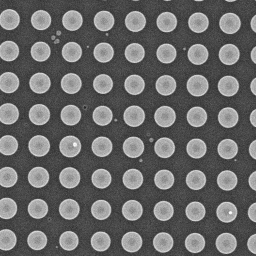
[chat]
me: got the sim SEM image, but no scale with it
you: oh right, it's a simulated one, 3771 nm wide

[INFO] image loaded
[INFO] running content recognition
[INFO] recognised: an array of small figures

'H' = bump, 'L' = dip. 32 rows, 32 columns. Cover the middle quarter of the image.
LLLLLLLLLLLLLLLLLLLLLLLLLLLLLLLL
LLLLLLLLLLLLLLLLLLLLLLLLLLLLLLLL
LHHLLLLLLLLLLLLLLLLLLLLLLLLLLLLL
HHHHLLLLHHHHLLLLHHHLLLLLHHHLLLLL
HHHHLLLHHHHHLLLHHHHHLLLHHHHHLLLH
HHHHLLLHHHHHLLLHHHHHLLLHHHHHLLLH
HHHHLLLLHHHHLLLLHHHHLLLHHHHHLLLH
LLLLLLLLLLLLLLLLLHLLLLLLHHHLLLLL
LLLLLLLLLLLLLLLLLLLLLLLLLLLLLLLL
LLLLLLLLLLLLLLLLLLLLLLLLLLLLLLLL
LHHLLLLLLLLLLLLLLLLLLLLLLLLLLLLL
HHHHLLLLHHHHLLLHHHHHLLLHHHHLLLLH
HHHHLLLHHHHHLLLHHHHHLLLHHHHHLLLH
HHHHLLLHHHHHLLLHHHHHLLLHHHHHLLLH
HHHHLLLLHHHHLLLHHHHHLLLHHHHLLLLH
LLLLLLLLLLLLLLLLLHLLLLLLHHLLLLLL
LLLLLLLLLLLLLLLLLLLLLLLLLLLLLLLL
LLLLLLLLLLLLLLLLLLLLLLLLLLLLLLLL
HHHLLLLLHHHLLLLLHHHLLLLLHHLLLLLL
HHHHLLLHHHHHLLLHHHHHLLLHHHHLLLLH
HHHHLLLHHHHHLLLHHHHHLLLHHHHHLLLH
HHHHLLLHHHHHLLLHHHHHLLLHHHHHLLLH
HHHLLLLLHHHLLLLHHHHLLLLHHHHLLLLH
LLLLLLLLLLLLLLLLLLLLLLLLLLLLLLLL
LLLLLLLLLLLLLLLLLLLLLLLLLLLLLLLL
LLLLLLLLLLLLLLLLLLLLLLLLLLLLLLLL
HHHLLLLLHHLLLLLLHHLLLLLLLLLLLLLL
HHHHLLLHHHHLLLLHHHHLLLLHHHHLLLLH
HHHHLLLHHHHHLLLHHHHHLLLHHHHLLLLH
HHHHLLLHHHHHLLLHHHHHLLLHHHHLLLLH
HHHLLLLLHHHLLLLHHHHLLLLHHHHLLLLH
LLLLLLLLLLLLLLLLLLLLLLLLLLLLLLLL